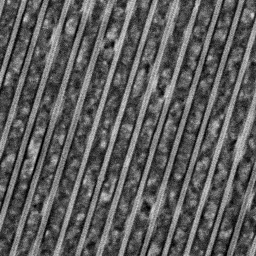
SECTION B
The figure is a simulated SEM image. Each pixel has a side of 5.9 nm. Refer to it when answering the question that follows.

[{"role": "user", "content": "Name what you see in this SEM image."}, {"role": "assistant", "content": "parallel lines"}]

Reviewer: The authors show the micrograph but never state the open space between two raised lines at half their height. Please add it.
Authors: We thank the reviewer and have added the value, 0.0946 micrometres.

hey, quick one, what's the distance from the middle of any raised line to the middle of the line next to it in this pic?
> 123 nanometres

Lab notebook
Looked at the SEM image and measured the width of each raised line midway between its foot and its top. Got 0.0276 microns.